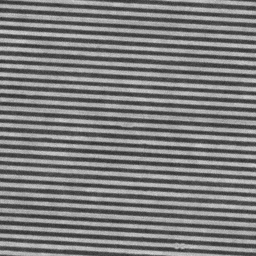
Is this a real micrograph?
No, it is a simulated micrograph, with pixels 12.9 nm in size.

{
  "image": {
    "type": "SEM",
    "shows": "parallel lines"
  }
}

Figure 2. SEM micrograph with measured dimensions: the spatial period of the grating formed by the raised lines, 109 nm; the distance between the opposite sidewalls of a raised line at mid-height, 46.6 nm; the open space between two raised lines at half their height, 57.8 nm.